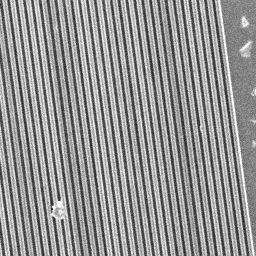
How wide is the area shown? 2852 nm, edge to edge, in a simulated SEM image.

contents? parallel lines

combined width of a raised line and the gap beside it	87	nm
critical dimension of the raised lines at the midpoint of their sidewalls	42.7	nm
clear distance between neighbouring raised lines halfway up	42.7	nanometres